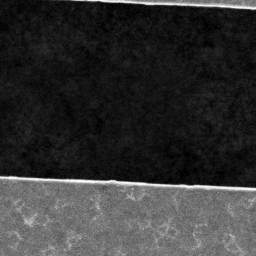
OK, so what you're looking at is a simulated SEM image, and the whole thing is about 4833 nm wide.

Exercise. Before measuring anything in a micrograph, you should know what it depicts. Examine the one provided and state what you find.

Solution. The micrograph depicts one or a few lines or trenches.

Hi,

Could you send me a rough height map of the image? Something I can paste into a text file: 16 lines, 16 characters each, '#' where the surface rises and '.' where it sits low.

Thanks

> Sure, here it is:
................
................
................
................
................
................
................
................
................
................
................
#########.......
################
################
################
################